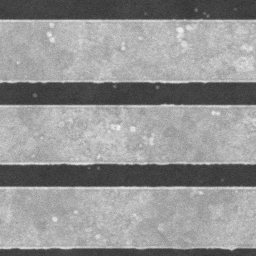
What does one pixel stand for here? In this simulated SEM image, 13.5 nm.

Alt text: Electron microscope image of lines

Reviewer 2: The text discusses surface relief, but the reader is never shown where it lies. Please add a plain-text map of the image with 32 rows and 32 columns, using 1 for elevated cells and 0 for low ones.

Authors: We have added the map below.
00000000000000000000000000000000
00000000000000000000000000000000
00000000000000000000000000000000
11111111111111111111111111111111
11111111111111111111111111111111
11111111111111111111111111111111
11111111111111111111111111111111
11111111111111111111111111111111
11111111111111111111111111111111
11111111111111111111111111111111
00000000000000000000000000000000
00000000000000000000000000000000
00000000000000000000000000000000
11111111111111111111111111111111
11111111111111111111111111111111
11111111111111111111111111111111
11111111111111111111111111111111
11111111111111111111111111111111
11111111111111111111111111111111
11111111111111111111111111111111
00000000000000000000000000000000
00000000000000000000000000000000
00000000000000000000000000000000
11111111111111111111111111111111
11111111111111111111111111111111
11111111111111111111111111111111
11111111111111111111111111111111
11111111111111111111111111111111
11111111111111111111111111111111
11111111111111111111111111111111
11111111111111111111111111111111
00000000000000000000000000000000